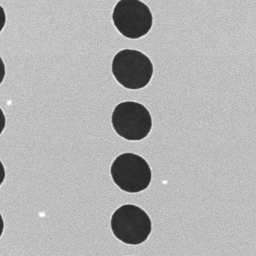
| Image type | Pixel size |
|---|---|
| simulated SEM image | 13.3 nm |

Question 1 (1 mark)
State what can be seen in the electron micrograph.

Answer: holes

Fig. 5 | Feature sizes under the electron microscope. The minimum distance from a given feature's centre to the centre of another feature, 688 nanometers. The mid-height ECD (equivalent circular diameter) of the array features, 536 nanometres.